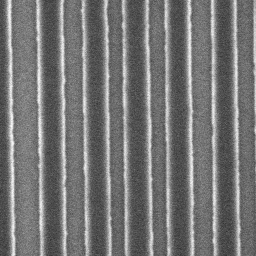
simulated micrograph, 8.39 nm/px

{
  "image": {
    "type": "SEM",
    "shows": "lines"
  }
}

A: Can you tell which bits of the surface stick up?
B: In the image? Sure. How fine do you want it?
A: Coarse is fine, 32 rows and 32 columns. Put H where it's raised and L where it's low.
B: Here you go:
HLLLLHHHLLHHHLLHHHLLLHHHLLHHHLLL
HLLLLHHHLLHHHLLHHHLLLHHHLLHHHLLL
HLLLLHHHLLHHHLLHHHLLLHHHLLHHHLLL
HLLLLHHHLLHHHLLHHHLLLHHHLLHHHLLL
HLLLLHHHLLHHHLLHHHLLLHHHLLHHHLLL
HLLLLHHHLLHHHLLHHHLLLHHHLLLHHLLL
HLLLLHHHLLHHHLLHHHHLLHHHLLLHHHLL
HLLLLHHHLLHHHLLHHHHLLHHHLLLHHLLL
HLLLLHHHLLHHHLLHHHHLLHHHLLLHHHLL
HLLLLHHHLLHHHLLHHHHLLHHHLLLHHHLL
HLLLLHHHLLHHHLLHHHHLLHHHLLLHHHLL
HLLLLHHHLLHHHLLHHHHLLHHHLLLHHHLL
HLLLLHHHLLHHHLLHHHHLLHHHLLLHHHLL
HLLLLHHHLLHHHLLHHHHLLHHHLLLHHHLL
HHLLLHHHLLLHHHLLHHHLLHHHLLLHHHLL
HHLLLHHHLLLHHHLLHHHLLHHHLLLHHHLL
HLLLLHHHLLLHHHLLHHHLLHHHLLLHHHLL
HHLLLHHHLLLHHHLLHHHLLHHHLLLHHHLL
HHLLLHHHLLLHHHLLHHHLLHHHLLLHHHLL
HHLLLHHHLLLHHHLLHHHLLHHHLLLHHHLL
HHLLLHHHLLLHHHLLHHHLLHHHLLLHHHLL
HHLLLHHHLLLHHHLLHHHLLHHHLLLHHHLL
HHLLLHHHLLLHHHLLHHHLLHHHLLLHHHLL
HHLLLHHHLLLHHHLLHHHLLHHHLLLHHHLL
HHLLLHHHLLLHHHLLHHHLLHHHLLLHHHLL
HHLLLHHHLLLHHHLLHHHLLHHHLLLHHHLL
HHLLLHHHLLLHHHLLHHHLLHHHLLLHHHLL
HHLLLHHHLLLHHHLLHHHLLHHHLLLHHHLL
HHLLLHHHLLLHHHLLHHHLLHHHLLLHHHLL
HHLLLHHHLLLHHHLLHHHLLHHHLLLHHHLL
HHLLLHHHLLLHHHLLHHHLLHHHLLLHHHLL
HHLLLHHHLLLHHHLLHHHLLHHHLLLHHHLL